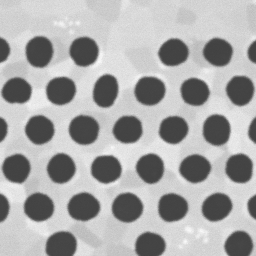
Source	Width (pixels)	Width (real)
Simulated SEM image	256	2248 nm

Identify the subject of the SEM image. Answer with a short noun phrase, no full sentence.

a regular array of holes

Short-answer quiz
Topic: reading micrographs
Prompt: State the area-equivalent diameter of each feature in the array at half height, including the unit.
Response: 260 nm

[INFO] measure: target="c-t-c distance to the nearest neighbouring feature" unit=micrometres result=0.387